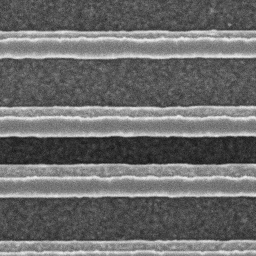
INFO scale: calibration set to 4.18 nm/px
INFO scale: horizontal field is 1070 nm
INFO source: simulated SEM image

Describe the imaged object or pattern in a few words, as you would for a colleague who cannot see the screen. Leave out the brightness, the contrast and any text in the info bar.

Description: lines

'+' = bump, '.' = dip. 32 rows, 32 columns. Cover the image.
................................
................................
................................
................................
++++++++++++++++++++++++++++++++
++++++++++++++++++++++++++++++++
++++++++++++++++++++++++++++++++
................................
................................
................................
................................
................................
................................
++++++++++++++++++++.+++++++++++
++++++++++++++++++++++++++++++++
++++++++++++++++++++++++++++++++
++++++++++++++++++++++++++++++++
................................
................................
................................
................................
++++++++++++++++++++++++++++++++
++++++++++++++++++++++++++++++++
++++++++++++++++++++++++++++++++
++.+++++.+...........+..........
................................
................................
................................
................................
................................
++++++++++++++++++++++++++++++++
++++++++++++++++++++++++++++++++